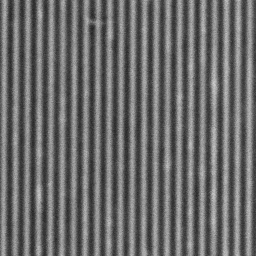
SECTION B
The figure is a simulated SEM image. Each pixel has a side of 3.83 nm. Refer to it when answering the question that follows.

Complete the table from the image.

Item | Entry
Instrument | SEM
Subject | parallel lines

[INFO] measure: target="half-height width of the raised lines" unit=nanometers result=17.7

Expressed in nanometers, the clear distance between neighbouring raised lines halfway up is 28.3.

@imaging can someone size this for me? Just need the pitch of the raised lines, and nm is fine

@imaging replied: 44.8